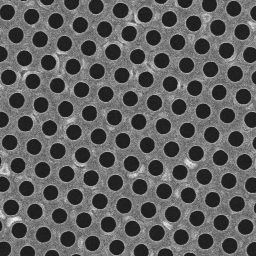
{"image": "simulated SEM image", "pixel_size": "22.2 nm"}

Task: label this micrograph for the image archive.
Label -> a regular array of holes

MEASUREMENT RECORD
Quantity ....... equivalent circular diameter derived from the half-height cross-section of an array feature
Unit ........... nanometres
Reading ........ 349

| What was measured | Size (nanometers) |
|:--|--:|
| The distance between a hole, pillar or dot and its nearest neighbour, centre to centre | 542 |